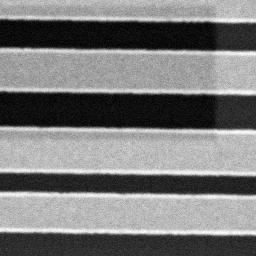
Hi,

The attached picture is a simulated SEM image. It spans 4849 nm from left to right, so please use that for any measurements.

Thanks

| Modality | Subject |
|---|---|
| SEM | lines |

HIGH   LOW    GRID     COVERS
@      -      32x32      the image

@@@@@@@@@@@@@@@@@@@@@@@@@@@@@@@@
@@@@@@@@@@@@@@@@@@@@@@@@@@@@@@@@
--------------------@@------@@@@
--------------------------------
--------------------------------
--------------------------------
@@@@@@@@@@@@@@@@----------------
@@@@@@@@@@@@@@@@@@@@@@@@@@@@@@@@
@@@@@@@@@@@@@@@@@@@@@@@@@@@@@@@@
@@@@@@@@@@@@@@@@@@@@@@@@@@@@@@@@
@@@@@@@@@@@@@@@@@@@@@@@@@@@@@@@@
----------------------@@@@@@@@@@
--------------------------------
--------------------------------
--------------------------------
--------------------------------
@@@@@@@@@@@@@@@@@@@@@@@@@@@@@@@@
@@@@@@@@@@@@@@@@@@@@@@@@@@@@@@@@
@@@@@@@@@@@@@@@@@@@@@@@@@@@@@@@@
@@@@@@@@@@@@@@@@@@@@@@@@@@@@@@@@
@@@@@@@@@@@@@@@@@@@@@@@@@@@@@@@@
---------------@-@@@@@@@@@@@@@@@
--------------------------------
--------------------------------
@@@@@@@@@@@@@@@@@@@@------------
@@@@@@@@@@@@@@@@@@@@@@@@@@@@@@@@
@@@@@@@@@@@@@@@@@@@@@@@@@@@@@@@@
@@@@@@@@@@@@@@@@@@@@@@@@@@@@@@@@
@@@@@@@@@@@@@@@@@@@@@@@@@@@@@@@@
--------------------------------
--------------------------------
--------------------------------